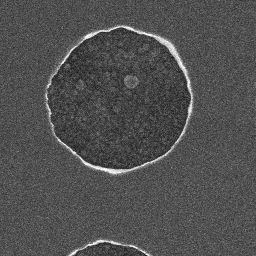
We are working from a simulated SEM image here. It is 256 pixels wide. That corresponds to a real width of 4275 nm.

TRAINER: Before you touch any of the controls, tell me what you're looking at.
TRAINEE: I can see holes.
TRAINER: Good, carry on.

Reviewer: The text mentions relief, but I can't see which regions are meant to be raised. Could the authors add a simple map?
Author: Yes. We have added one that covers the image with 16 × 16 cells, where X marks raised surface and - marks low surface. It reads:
XXXXXXXXXXXXXXXX
XXXXXXXXXXXXXXXX
XXXXX-----XXXXXX
XXXX-------XXXXX
XXXX--------XXXX
XXX---------XXXX
XXX---------XXXX
XXX---------XXXX
XXXX-------XXXXX
XXXXX-----XXXXXX
XXXXXXX-XXXXXXXX
XXXXXXXXXXXXXXXX
XXXXXXXXXXXXXXXX
XXXXXXXXXXXXXXXX
XXXXXXXXXXXXXXXX
XXXXX---XXXXXXXX